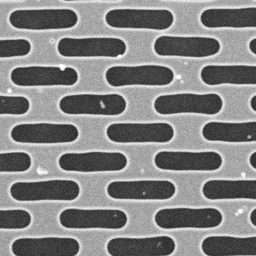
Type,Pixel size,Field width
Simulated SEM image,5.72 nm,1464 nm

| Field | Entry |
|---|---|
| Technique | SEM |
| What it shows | groups of lines, slits or small figures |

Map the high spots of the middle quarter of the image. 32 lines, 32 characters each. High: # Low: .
#############...##.......#######
...########................#####
...#######..................####
....######.................#####
...########................#####
############...#################
################################
###...........############......
...............########.........
...............########.........
................######..........
...............########.........
#.............##########....####
################################
################################
...########................#####
...########................#####
....#######.................####
...########................#####
.############............#######
################################
################################
...............########.........
................#######.........
................#######.........
...............########.........
..............###########.......
################################
################################
...#########...............#####
....#######.................####
....#######.................####